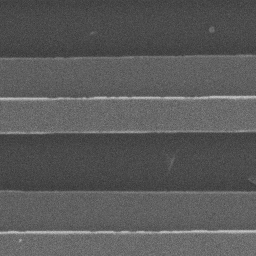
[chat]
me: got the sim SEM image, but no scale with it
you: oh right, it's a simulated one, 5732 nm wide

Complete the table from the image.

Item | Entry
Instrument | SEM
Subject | lines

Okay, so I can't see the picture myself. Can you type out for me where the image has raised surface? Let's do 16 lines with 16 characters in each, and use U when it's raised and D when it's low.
DDDDDDDDDDDDDDDD
DDDDDDDDDDDDDDDD
DDDDDDDDDDDDDDDD
DDDDDDDDDDDDDDDD
UUUUUUUUUUUUUUUU
UUUUUUUUUUUUUUUU
UUUUUUUUUUUUUUUU
UUUUUUUUUUUUUUUU
DDDDDDDDDDDDDDDD
DDDDDDDDDDDDDDDD
DDDDDDDDDDDDDDDD
DDDDDDDDDDDDDDDD
UUUUUUUUUUUUUUUU
UUUUUUUUUUUUUUUU
UUUUUUUUUUUUUUUU
UUUUUUUUUUUUUUUU